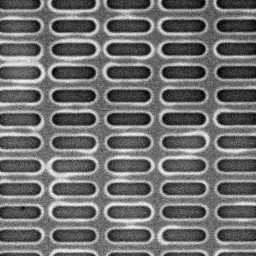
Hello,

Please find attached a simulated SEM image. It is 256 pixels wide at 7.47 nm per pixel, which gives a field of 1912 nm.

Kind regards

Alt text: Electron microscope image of groups of lines, slits or small figures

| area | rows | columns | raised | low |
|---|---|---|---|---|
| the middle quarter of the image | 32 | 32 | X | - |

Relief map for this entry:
------XXXXX---------XXXXXX------
--------XX------------XXX-------
--------XX------------XX--------
-------XXXX----------XXXX-------
XXXXXXXXXXXXXXXXXXXXXXXXXXXXXXXX
XXXXXXXXXXXXXXXXXXXXXXXXXXXXXXXX
-------XXXXX---------XXXX-------
--------XXX-----------XX--------
--------XXX-----------XX--------
-------XXXX----------XXXX-------
XXXXXXXXXXXXXXXXXXXXXXXXXXXXXXXX
XXXXXXXXXXXXXXXXXXXXXXXXXXXXXXXX
--------XXX----------XXXX-------
--------XXX-----------XX--------
--------XXX-----------XX--------
-------XXXXX---------XXXXX------
XXXXXXXXXXXXXXXXXXXXXXXXXXXXXXXX
XXXXXXXXXXXXXXXXXXXXXXXXXXXXXXXX
--------XXX-----------XXX-------
--------XXX-----------XX--------
--------XXX-----------XXX-------
XXXX---XXXXXXXX-XXXXXXXXXXXXXXX-
XXXXXXXXXXXXXXXXXXXXXXXXXXXXXXXX
XXXXXXXXXXXXXX-XXXXXXXXXXXXXX---
--------XXX-----------XX--------
--------XXX-----------XX--------
--------XXX-----------XX--------
--XXXXXXXXXXXXXXXXXXXXXXXXXXXXXX
XXXXXXXXXXXXXXXXXXXXXXXXXXXXXXXX
-------XXXXX--------XXXXXX------
--------XXX-----------XXX-------
--------XXX-----------XX--------